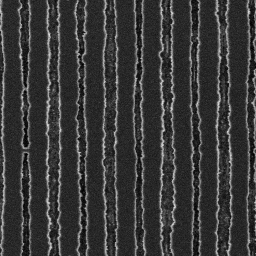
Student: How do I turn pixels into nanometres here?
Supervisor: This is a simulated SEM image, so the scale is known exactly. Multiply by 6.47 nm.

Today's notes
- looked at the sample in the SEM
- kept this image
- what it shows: parallel lines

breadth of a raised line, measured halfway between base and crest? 0.13 microns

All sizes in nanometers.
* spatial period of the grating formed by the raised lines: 183